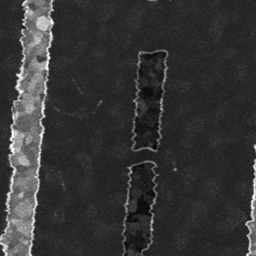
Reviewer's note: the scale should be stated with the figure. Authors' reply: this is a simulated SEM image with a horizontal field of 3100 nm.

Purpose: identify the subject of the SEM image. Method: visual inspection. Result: one or a few lines or trenches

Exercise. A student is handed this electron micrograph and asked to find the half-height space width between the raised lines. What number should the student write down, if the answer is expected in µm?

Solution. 1.11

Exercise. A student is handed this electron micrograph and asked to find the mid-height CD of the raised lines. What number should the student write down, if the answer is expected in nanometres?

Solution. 321